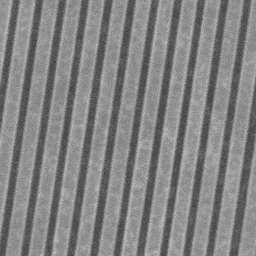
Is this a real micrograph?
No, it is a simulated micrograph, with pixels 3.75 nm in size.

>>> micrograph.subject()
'parallel lines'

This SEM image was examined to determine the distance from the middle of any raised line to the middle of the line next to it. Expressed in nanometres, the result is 85.8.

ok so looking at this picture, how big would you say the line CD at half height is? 51.8 nm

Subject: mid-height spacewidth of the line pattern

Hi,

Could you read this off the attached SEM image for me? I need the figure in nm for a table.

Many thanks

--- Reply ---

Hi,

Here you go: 33.3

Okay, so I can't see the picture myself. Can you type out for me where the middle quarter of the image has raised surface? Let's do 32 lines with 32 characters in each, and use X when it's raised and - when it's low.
XX--XXXX--XXX---XXX---XXX--XXXX-
XX--XXX---XXX---XXX--XXXX--XXXX-
XX--XXX---XXX---XXX--XXXX--XXX--
X---XXX--XXXX--XXXX--XXXX--XXX--
X---XXX--XXXX--XXXX--XXX---XXX--
X--XXXX--XXXX--XXX---XXX---XXX--
X--XXXX--XXX---XXX---XXX--XXXX--
X--XXXX--XXX---XXX---XXX--XXXX--
X--XXX---XXX---XXX--XXXX--XXX---
---XXX---XXX---XXX--XXXX--XXX---
---XXX--XXXX--XXXX--XXX---XXX---
---XXX--XXXX--XXXX--XXX---XXX--X
--XXXX--XXX---XXX---XXX---XXX--X
--XXXX--XXX---XXX---XXX--XXXX--X
--XXX---XXX---XXX---XXX--XXXX--X
--XXX---XXX---XXX--XXXX--XXX---X
--XXX---XXX---XXX--XXXX--XXX---X
--XXX--XXXX--XXXX--XXX---XXX---X
--XXX--XXXX--XXXX--XXX---XXX--XX
-XXXX--XXX---XXX---XXX---XXX--XX
-XXXX--XXX---XXX---XXX--XXXX--XX
-XXX---XXX---XXX--XXXX--XXXX--XX
-XXX---XXX---XXX--XXXX--XXX---XX
-XXX--XXXX--XXXX--XXXX--XXX---XX
-XXX--XXXX--XXXX--XXX---XXX--XXX
XXXX--XXXX--XXXX--XXX---XXX--XXX
XXXX--XXX---XXX---XXX--XXXX--XXX
XXXX--XXX---XXX---XXX--XXXX--XXX
XXX---XXX--XXXX--XXXX--XXXX--XXX
XXX---XXX---XXX--XXXX--XXX---XXX
XXX--XXXX--XXXX--XXXX--XXX---XXX
XXX--XXXX--XXXX--XXX---XXX--XXXX